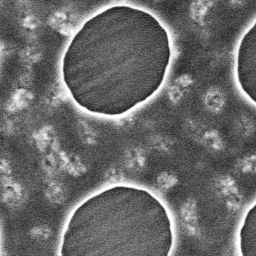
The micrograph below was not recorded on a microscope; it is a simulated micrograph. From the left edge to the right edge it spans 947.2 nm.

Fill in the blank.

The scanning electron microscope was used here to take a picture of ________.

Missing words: holes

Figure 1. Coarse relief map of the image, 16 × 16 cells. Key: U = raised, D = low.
UUUUUUUDUUUUUUUU
UUUUUDDDDDUUUUUU
UUUUUDDDDDDUUUUD
UUUUDDDDDDDUUUUD
UUUUDDDDDDUUUUUD
UUUUDDDDDDUUUUUD
UUUUUDDDDUUUUUUU
UUUUUUUUUUUUUUUU
UUUUUUUUUUUUUUUU
UUUUUUUUUUUUUUUU
UUUUUUUUUUUUUUUU
UUUUUUUUUUUUUUUU
UUUUUDDDDDUUUUUU
UUUUDDDDDDDUUUUD
UUUUDDDDDDDUUUUD
UUUUDDDDDDDUUUUD